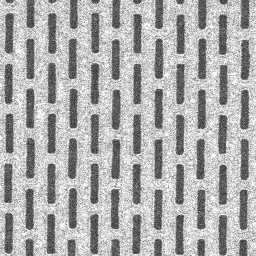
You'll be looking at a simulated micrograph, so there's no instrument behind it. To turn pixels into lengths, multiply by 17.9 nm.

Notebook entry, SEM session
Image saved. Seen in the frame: a regular array of holes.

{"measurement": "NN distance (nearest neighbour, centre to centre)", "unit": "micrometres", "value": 0.581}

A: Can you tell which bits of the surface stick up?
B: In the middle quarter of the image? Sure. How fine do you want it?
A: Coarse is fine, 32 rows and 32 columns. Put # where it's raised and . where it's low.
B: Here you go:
#..####..###..###...###..###..##
#..####..###..###...###..###..##
#..####..###..###...###..###..##
#..####..###..###..####.####..##
#######..########..#########..##
#######..########..#########..##
#..####..###..###..####..###..##
#...###..###..###..####..###..##
#...###..###..###..####..###..##
#...###..###..###..###...###..##
#...########..########...#######
#...########..########...#######
#...########..####.###...#######
#...###..###..###..###...###..##
#..####..###..###..###...###..##
#..####..###..###..####..###..##
#######..########..#########..##
#######..########..#########..##
##.####..########..#########..##
#..####..###..###..###...###..##
#..###...###..###..###...###..##
#..###...###..###..###...###..##
#..####.####..####.###...###..##
#..#########..########...#######
#..#########..########...#######
#..###...###..###..###...###..##
#..###...###..###..###...###..##
#..###...###..###..###...###..##
#..###...###..###..####..###..##
######...########..#########..##
######...########..#########..##
#..###...###..###..####.####..##